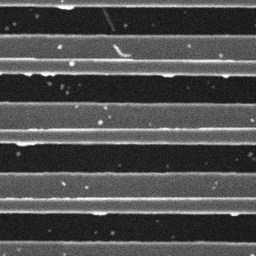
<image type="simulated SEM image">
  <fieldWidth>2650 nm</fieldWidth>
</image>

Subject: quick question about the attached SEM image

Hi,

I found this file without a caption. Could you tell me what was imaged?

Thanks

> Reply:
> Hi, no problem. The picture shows lines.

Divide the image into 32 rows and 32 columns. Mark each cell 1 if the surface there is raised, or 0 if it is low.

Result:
11111111111111111111111111111111
00000000000000000000000000000000
00000000000000000000000000000000
00000000000000000000000000000000
11111111010011001000111000111000
11111111111111111111111111111111
11111111111111111111111111111111
11111111111111111111111111111111
11111111111111111111111111111111
00000000000000000000110000001000
00000000000000000000000000000000
00000000000000000000000000000000
00000000000000000000000000000000
11111111111111111111111111111111
11111111111111111111111111111111
11111111111111111111111111111111
11111111111111111111111111111111
11111111111111111111111111111111
00000000000000000000000000000000
00000000000000000000000000000000
00000000000000000000000000000000
00000000000000000000000000000000
11111111111111111111111111111111
11111111111111111111111111111111
11111111111111111111111111111111
11111111111111111111111111111111
11111111111111111111111111111111
00000000000000000000000000000000
00000000000000000000000000000000
00000000000000000000000000000000
11111111111111111111111111111111
11111111111111111111111111111111